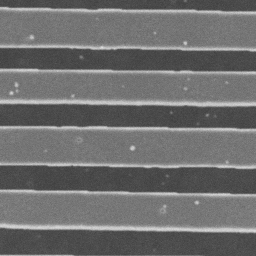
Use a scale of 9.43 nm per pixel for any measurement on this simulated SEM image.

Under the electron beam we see lines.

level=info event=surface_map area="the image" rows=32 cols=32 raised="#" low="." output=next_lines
................................
############################....
################################
################################
################################
################################
................................
................................
................................
################################
################################
################################
################################
................................
................................
................................
################################
################################
################################
################################
################################
................................
................................
................................
################################
################################
################################
################################
....############################
................................
................................
................................